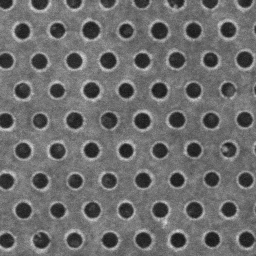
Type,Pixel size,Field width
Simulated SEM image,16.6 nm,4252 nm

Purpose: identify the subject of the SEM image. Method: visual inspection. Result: a regular array of holes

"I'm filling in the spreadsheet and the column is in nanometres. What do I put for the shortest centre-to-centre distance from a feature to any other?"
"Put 560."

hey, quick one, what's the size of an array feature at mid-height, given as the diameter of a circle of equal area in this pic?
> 0.284 um